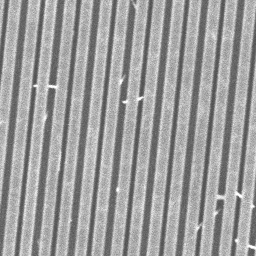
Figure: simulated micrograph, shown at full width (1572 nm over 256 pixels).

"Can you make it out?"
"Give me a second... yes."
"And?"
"parallel lines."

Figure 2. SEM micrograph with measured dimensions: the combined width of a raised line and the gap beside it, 17.9 pixels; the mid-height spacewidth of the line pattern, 33.6 nm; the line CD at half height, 72.6 nm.